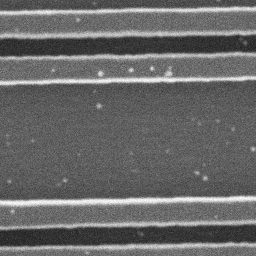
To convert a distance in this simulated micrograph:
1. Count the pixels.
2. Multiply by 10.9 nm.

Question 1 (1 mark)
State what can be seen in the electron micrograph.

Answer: lines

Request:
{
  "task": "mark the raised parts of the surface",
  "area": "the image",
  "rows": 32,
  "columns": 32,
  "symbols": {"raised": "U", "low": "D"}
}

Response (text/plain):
DDDDDDDDDDDDDDDDDDDDDDDDDDDDDDDD
DUUUUUUUUUUUUUUUUUUUUUUUUUUUUUUU
UUUUUUUUUUUUUUUUUUUUUUUUUUUUUUUU
UUUUUUUUUUUUUUUUUUUUUUUUUUUUUUUU
UUUUUUUUUUUUDDDDDDDDDDDDDDDDDDDD
DDDDDDDDDDDDDDDDDDDDDDDDDDDDDDDD
DDDDDDDDDDDDDDDDDDDDDDDDDDDDDDDD
UUUUUUUUUUUUUUUUUUUUUUUUUUUUUUUU
UUUUUUUUUUUUUUUUUUUUUUUUUUUUUUUU
UUUUUUUUUUUUUUUUUUUUUUUUUUUUUUUU
DDDDDDDDDDDDDDDDDDDDDDDDDDDDDDDD
DDDDDDDDDDDDDDDDDDDDDDDDDDDDDDDD
DDDDDDDDDDDDDDDDDDDDDDDDDDDDDDDD
DDDDDDDDDDDDDDDDDDDDDDDDDDDDDDDD
DDDDDDDDDDDDDDDDDDDDDDDDDDDDDDDD
DDDDDDDDDDDDDDDDDDDDDDDDDDDDDDDD
DDDDDDDDDDDDDDDDDDDDDDDDDDDDDDDD
DDDDDDDDDDDDDDDDDDDDDDDDDDDDDDDD
DDDDDDDDDDDDDDDDDDDDDDDDDDDDDDDD
DDDDDDDDDDDDDDDDDDDDDDDDDDDDDDDD
DDDDDDDDDDDDDDDDDDDDDDDDDDDDDDDD
DDDDDDDDDDDDDDDDDDDDDDDDDDDDDDDD
DDDDDDDDDDDDDDDDDDDDDDDDDDDDDDDD
DDDDDDDDDDDDDDDDDDDDDDDDDDDDDDDD
DDDDDDDDDDDDDDDDDDDDDDDDDDDDDDDD
UUUUUUUUUUUUUUUUUUUUUUUUUUUUUUUU
UUUUUUUUUUUUUUUUUUUUUUUUUUUUUUUU
UUUUUUUUUUUUUUUUUUUUUUUUUUUUUUUU
UUUUUDDDDDDDDDDDDDDDDDDDDDDDDDDD
DDDDDDDDDDDDDDDDDDDDDDDDDDDDDDDD
DDDDDDDDDDDDDDDDDDDDDDDDDDDDUUUU
UUUUUUUUUUUUUUUUUUUUUUUUUUUUUUUU